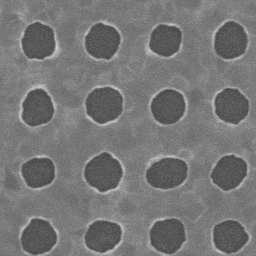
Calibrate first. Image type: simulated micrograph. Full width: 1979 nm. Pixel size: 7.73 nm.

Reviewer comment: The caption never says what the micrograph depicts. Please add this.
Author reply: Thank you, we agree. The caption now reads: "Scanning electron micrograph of a regular array of holes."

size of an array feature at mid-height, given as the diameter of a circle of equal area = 280 nanometres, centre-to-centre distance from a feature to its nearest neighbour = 0.488 µm